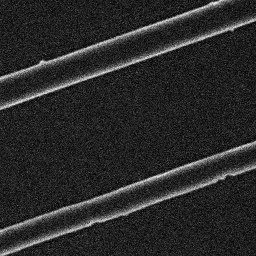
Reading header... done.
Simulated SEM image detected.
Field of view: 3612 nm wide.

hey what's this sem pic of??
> one or a few lines or trenches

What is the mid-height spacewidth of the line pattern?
1610 nm